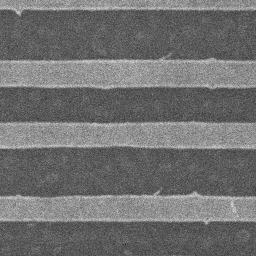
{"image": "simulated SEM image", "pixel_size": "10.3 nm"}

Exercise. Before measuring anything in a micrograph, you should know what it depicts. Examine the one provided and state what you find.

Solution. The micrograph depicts one or a few lines or trenches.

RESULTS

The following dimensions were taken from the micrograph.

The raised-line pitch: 698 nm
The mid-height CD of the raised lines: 249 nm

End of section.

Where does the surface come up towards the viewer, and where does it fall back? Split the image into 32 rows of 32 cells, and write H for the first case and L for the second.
HHHHHHHHHHHHHHHHHHHHHHHHHHHHHHHH
LLLLLLLLLLLLLLLLLLLLLLLLLLLLLLLL
LLLLLLLLLLLLLLLLLLLLLLLLLLLLLLLL
LLLLLLLLLLLLLLLLLLLLLLLLLLLLLLLL
LLLLLLLLLLLLLLLLLLLLLLLLLLLLLLLL
LLLLLLLLLLLLLLLLLLLLLLLLLLLLLLLL
LLLLLLLLLLLLLLLLLLLLLLLLLLLLLLLL
LLLLLLLLLLLLLLLLLLLLLLLLLLLLLLLL
HHHHHHHHHHHHHHHHHHHHHHHHHHHHHHHH
HHHHHHHHHHHHHHHHHHHHHHHHHHHHHHHH
HHHHHHHHHHHHHHHHHHHHHHHHHHHHHHHH
LLLLLLLLLLLLLLLLLLLLLLLLLLLLLLLL
LLLLLLLLLLLLLLLLLLLLLLLLLLLLLLLL
LLLLLLLLLLLLLLLLLLLLLLLLLLLLLLLL
LLLLLLLLLLLLLLLLLLLLLLLLLLLLLLLL
LLLLHHHLLLLLLLLLLHHHHHHHHHHHHHLL
HHHHHHHHHHHHHHHHHHHHHHHHHHHHHHHH
HHHHHHHHHHHHHHHHHHHHHHHHHHHHHHHH
LLLLLLLLLLLLLLLLLLLLLLLLLLLLLLLL
LLLLLLLLLLLLLLLLLLLLLLLLLLLLLLLL
LLLLLLLLLLLLLLLLLLLLLLLLLLLLLLLL
LLLLLLLLLLLLLLLLLLLLLLLLLLLLLLLL
LLLLLLLLLLLLLLLLLLLLLLLLLLLLLLLL
LLLLLLLLLLLLLLLLLLLLLLLLLLLLLLLL
LLLLLLLLLLLLLLLLLLLHLLLLHLLLLLLL
HHHHHHHHHHHHHHHHHHHHHHHHHHHHHHHH
HHHHHHHHHHHHHHHHHHHHHHHHHHHHHHHH
LLLLLLLLLLLLLLLLLLLLLLLLLHHLLLLH
LLLLLLLLLLLLLLLLLLLLLLLLLLLLLLLL
LLLLLLLLLLLLLLLLLLLLLLLLLLLLLLLL
LLLLLLLLLLLLLLLLLLLLLLLLLLLLLLLL
LLLLLLLLLLLLLLLLLLLLLLLLLLLLLLLL